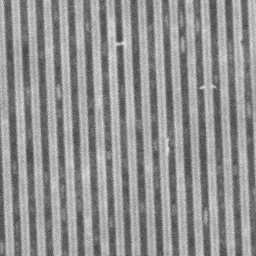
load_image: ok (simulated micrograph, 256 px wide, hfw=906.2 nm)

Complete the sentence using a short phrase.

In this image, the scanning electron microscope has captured parallel lines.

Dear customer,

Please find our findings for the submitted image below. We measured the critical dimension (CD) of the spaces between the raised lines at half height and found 30.5 nanometers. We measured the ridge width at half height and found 24.3 nm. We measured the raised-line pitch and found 55.7 nanometers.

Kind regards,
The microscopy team